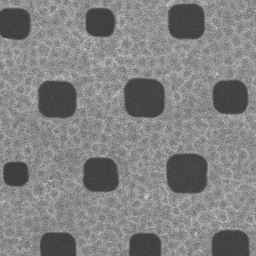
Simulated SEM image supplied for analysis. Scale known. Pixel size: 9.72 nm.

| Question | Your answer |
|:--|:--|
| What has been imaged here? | holes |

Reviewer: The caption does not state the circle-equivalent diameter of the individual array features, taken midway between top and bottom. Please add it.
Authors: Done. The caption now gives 0.373 um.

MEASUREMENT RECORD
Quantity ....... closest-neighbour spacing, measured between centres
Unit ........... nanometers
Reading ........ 841